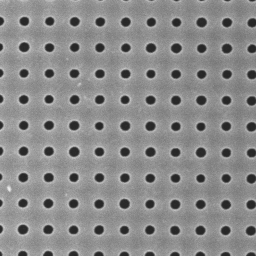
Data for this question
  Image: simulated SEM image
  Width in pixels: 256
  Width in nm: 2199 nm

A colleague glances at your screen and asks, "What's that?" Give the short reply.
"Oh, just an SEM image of a regular array of holes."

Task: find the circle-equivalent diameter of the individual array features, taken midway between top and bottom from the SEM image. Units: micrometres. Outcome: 0.085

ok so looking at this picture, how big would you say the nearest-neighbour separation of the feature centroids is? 216 nanometres